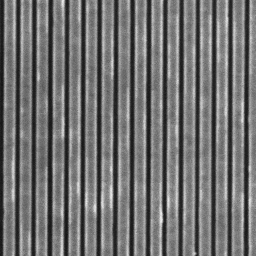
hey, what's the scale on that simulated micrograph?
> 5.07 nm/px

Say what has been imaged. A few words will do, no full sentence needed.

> parallel lines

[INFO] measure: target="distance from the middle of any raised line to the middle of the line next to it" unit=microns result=0.0829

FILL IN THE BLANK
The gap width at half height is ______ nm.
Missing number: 27.3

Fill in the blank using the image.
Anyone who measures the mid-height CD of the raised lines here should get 54.5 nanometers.